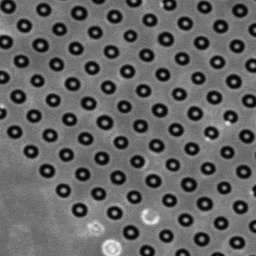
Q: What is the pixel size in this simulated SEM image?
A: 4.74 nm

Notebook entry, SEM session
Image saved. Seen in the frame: a regular array of ring-shaped grooves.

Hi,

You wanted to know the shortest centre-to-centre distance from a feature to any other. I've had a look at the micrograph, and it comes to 118 nanometers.